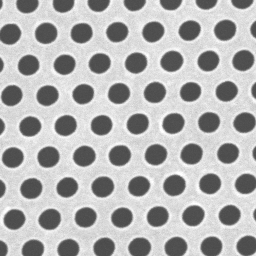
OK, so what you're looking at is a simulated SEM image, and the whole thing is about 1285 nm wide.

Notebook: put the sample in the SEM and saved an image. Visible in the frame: a regular array of holes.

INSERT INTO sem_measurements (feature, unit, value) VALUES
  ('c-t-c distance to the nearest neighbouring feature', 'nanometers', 178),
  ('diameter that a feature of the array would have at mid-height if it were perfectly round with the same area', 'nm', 109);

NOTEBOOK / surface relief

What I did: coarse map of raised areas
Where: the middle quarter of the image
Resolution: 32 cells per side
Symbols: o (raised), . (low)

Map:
...ooo......ooo......ooo.....ooo
..ooooo....ooooo....ooooo...oooo
..oooooo.ooooooooooooooooooooooo
oooooooooooooooooooooooooooooooo
oooooooooooooooooooooo.oooooooo.
ooo....ooooo....ooooo....ooooo..
oo.....oooo.....oooo......ooo...
oo.....oooo......ooo.....oooo...
oo.....oooo.....oooo.....oooo...
ooo....ooooo...oooooo...ooooooo.
oooooooooooooooooooooooooooooooo
oooooooooooooooooooooooooooooooo
oooooooooooooooooo..oooooo...ooo
...ooooo....oooo.....oooo.....oo
...oooo.....oooo.....oooo.....oo
...ooo......oooo.....ooo......oo
...oooo.....oooo.....oooo.....oo
..oooooo...oooooo..ooooooo..oooo
oooooooooooooooooooooooooooooooo
oooooooooooooooooooooooooooooooo
oooo..ooooooo..oooooo....ooooo..
ooo.....oooo....ooooo.....ooo...
oo......ooo......ooo......ooo...
oo......ooo......ooo......ooo...
oo.....ooooo....ooooo....ooooo..
oooo..ooooooo..ooooooooooooooooo
oooooooooooooooooooooooooooooooo
oooooooooooooooooooooooooooooooo
..oooooo...oooooo....ooooo....oo
...oooo.....oooo.....oooo......o
....ooo......ooo......ooo......o
...oooo.....oooo.....oooo.....oo